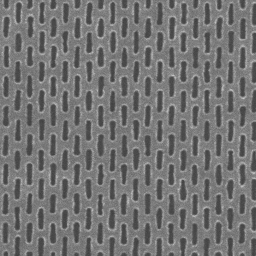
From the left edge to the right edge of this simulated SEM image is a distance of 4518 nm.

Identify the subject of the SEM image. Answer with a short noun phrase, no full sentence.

a regular array of holes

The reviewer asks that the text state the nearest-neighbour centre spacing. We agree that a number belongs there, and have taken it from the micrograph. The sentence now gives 320 nm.